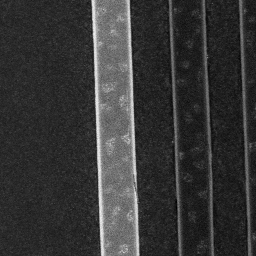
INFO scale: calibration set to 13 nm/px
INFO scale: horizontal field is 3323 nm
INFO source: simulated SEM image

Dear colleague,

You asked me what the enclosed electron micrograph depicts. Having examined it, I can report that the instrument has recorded one or a few lines or trenches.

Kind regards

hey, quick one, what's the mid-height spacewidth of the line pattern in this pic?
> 38.9 pixels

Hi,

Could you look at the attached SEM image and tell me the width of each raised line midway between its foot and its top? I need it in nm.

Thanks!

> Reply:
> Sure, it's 451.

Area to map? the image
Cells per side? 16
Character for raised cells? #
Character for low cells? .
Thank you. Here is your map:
......##...##..#
......##...##..#
......##...##..#
......##...##..#
......##...##..#
......##...##..#
......##...##..#
......##...##..#
......##...##..#
......##...##..#
......##...##..#
......###..##..#
......###..##..#
......###..##...
......###..##...
......###..##...